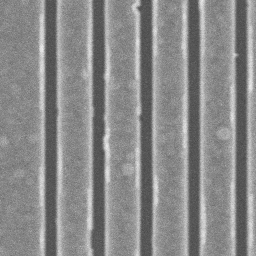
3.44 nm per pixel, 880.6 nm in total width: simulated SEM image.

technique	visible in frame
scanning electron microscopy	parallel lines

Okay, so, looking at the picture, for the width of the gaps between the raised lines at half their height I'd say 46.4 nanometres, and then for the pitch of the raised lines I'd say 164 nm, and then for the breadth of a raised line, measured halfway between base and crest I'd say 118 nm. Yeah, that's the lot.